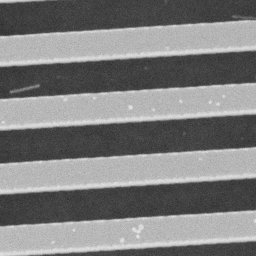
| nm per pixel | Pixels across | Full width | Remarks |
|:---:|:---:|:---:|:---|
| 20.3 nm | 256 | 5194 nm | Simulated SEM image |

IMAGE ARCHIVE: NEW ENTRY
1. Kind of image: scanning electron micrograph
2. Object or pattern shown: lines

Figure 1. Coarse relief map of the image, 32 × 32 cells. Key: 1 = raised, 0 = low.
00000000000000000000000000000000
00000000000000000000000000000000
00000000000000000000000000000000
00000000000000000111111111111111
01111111111111111111111111111111
11111111111111111111111111111111
11111111111111111111111111111000
11111111111100000000000000000000
00000000000000000000000000000000
00000000000000000000000000000000
00000000000000000000000000000011
00000000000000001111111111111111
11111111111111111111111111111111
11111111111111111111111111111111
11111111111111111111111111110000
11111111111100000000000000000000
00000000000000000000000000000000
00000000000000000000000000000000
00000000000000000000000000000001
00000000000000011111111111111111
11111111111111111111111111111111
11111111111111111111111111111111
11111111111111111111111111100000
11111111111100000000000000000000
00000000000000000000000000000000
00000000000000000000000000000000
00000000000000000000000000000011
00000000000000111111111111111111
11111111111111111111111111111111
11111111111111111111111111111111
11111111111111111111111110000000
11111111100000000000000000000000